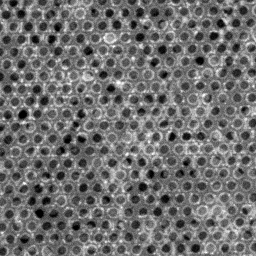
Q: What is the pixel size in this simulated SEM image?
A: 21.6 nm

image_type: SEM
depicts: a regular array of raised bodies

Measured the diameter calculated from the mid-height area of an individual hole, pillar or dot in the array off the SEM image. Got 0.229 um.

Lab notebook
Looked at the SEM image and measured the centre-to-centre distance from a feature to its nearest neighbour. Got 305 nanometres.